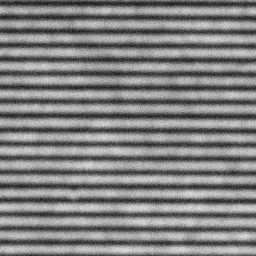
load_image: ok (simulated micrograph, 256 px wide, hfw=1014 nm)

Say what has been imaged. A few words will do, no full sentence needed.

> parallel lines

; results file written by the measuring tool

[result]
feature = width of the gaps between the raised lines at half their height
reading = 0.0242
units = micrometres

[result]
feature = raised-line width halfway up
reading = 0.0317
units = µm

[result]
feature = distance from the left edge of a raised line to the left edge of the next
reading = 55.7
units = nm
